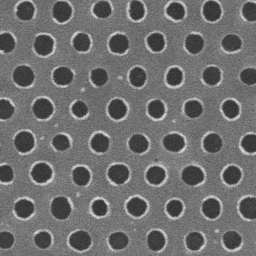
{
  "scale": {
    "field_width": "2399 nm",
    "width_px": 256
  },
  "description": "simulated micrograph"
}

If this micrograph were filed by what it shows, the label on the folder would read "a regular array of holes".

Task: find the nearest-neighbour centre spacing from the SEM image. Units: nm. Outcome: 343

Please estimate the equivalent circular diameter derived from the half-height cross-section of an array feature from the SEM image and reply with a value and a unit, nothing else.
182 nm